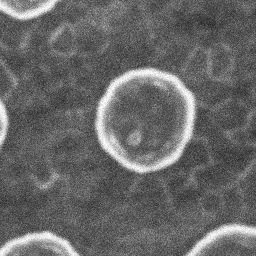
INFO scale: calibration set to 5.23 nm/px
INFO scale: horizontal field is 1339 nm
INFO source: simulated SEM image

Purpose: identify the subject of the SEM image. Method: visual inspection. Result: raised bodies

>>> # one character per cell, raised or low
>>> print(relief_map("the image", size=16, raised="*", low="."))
***.............
................
................
................
................
.......****.....
......******....
......******....
......******....
.......****.....
........**......
................
................
................
..............**
****........****